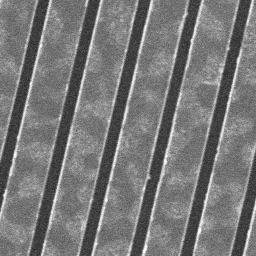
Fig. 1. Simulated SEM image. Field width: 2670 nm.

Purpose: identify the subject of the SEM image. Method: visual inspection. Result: parallel lines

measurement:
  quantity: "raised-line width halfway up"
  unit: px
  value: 36.9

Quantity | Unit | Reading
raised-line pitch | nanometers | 513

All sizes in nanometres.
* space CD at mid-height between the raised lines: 132